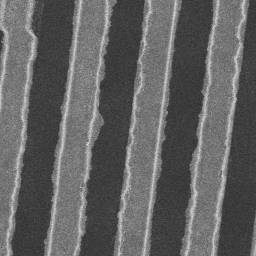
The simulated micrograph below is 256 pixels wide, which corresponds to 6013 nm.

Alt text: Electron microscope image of one or a few lines or trenches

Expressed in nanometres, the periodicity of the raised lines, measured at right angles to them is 1610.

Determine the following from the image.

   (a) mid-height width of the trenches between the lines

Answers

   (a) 993 nm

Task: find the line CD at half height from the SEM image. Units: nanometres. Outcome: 618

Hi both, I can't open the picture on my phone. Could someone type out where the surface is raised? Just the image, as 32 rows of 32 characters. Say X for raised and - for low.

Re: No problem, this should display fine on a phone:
XXXX------XXX------XXX-----XXX--
XXXX------XXX------XXX-----XXX--
XXXX------XXX-----XXXX-----XXX--
XXX-------XXX-----XXX------XXX--
-XXX------XXX-----XXX------XXX--
-XXX-----XXXX-----XXX-----XXXX--
-XXX-----XXXX-----XXX-----XXXX--
-XXX-----XXXX-----XXX-----XXX---
-XXX-----XXX------XXX-----XXXX--
XXX------XXX------XXX-----XXX---
XXX------XXX------XXX-----XXX---
XXX------XXX-----XXX------XXX---
XXX------XXX-----XXX------XXX---
XXX-----XXXX-----XXX------XXX---
XXX-----XXXX-----XXX------XXX---
XXX-----XXX------XXX-----XXXX---
XXX-----XXX------XXX-----XXXX---
XXX-----XXX------XXX-----XXX----
XXX-----XXX-----XXXX-----XXX----
XX------XXX-----XXX------XXX----
XX-----XXXX-----XXX------XXX----
XX-----XXXX-----XXX------XXX----
XX-----XXXX-----XXX-----XXXX----
XX-----XXX------XXX-----XXXX----
XX-----XXX-----XXXX-----XXXX----
XX-----XXX------XXX-----XXX-----
XX-----XXX-----XXXX-----XXX-----
X------XXX-----XXX------XXX-----
X------XXX-----XXX------XXX-----
X-----XXXX-----XXX------XXX-----
X-----XXXX-----XXX------XXX-----
X-----XXX------XXX-----XXXX-----